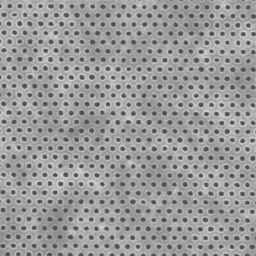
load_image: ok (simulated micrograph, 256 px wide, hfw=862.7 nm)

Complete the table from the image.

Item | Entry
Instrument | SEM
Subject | a regular array of holes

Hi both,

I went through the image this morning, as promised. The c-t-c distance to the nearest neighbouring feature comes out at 33.2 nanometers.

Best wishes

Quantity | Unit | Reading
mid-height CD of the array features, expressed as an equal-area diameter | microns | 0.0161